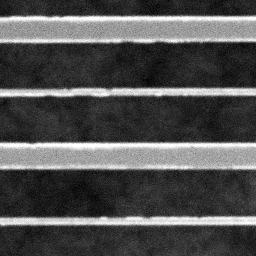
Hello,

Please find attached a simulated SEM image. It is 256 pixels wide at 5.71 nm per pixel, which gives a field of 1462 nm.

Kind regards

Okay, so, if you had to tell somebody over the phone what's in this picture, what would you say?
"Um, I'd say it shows lines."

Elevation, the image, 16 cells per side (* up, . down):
................
****************
****************
................
................
................
................
................
................
****************
****************
................
................
................
................
................